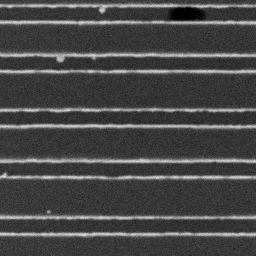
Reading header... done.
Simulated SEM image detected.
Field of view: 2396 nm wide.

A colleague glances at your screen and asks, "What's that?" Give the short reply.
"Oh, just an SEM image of lines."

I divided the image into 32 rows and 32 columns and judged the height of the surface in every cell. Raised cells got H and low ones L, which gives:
HHHHHHHHHHHHHHHHHHHHHHHHHHHHHHHH
LLLLLLLLLLLLLLLLLLLLLLLLLLLLLLLL
LLLLLLLLLLLLLLLLLLLLLLLLLLLLLLLL
HHHHHHHHHHHHHHHHHHHHHHHHHHHHHHHH
HHHHHHHHHHHHHHHHHHHHHHHHHHHHHHHH
HHHHHHHHHHHHHHHHHHHHHHHHHHHHHHHH
HHHHHHHHHHHHHHHHHHHHHHHHHHHHHHHH
LLLLLLLLLLLLLLLLLLLLLLLLLLLLLLLL
LLLLLLLLLLLLLLLLLLLLLLLLLLLLLLLL
HHHHHHHHHHHHHHHHHHHHHHHHHHHHHHHH
HHHHHHHHHHHHHHHHHHHHHHHHHHHHHHHH
HHHHHHHHHHHHHHHHHHHHHHHHHHHHHHHH
HHHHHHHHHHHHHHHHHHHHHHHHHHHHHHHH
HHHHHHHHHHHHHHHHHHHHHHHHHHHHHHHH
LLLLLLLLLLLLLLLLLLLLLLLLLLLLLLLL
LLLLLLLLLLLLLLLLLLLLLLLLLLLLLLLL
HHHHHHHHHHHHHHHHHHHHHHHHHHHHHHHH
HHHHHHHHHHHHHHHHHHHHHHHHHHHHHHHH
HHHHHHHHHHHHHHHHHHHHHHHHHHHHHHHH
HHHHHHHHHHHHHHHHHHHHHHHHHHHHHHHH
LLLLLLLLLLLLLLLLLLLLLLLLLLLLLLLL
LLLLLLLLLLLLLLLLLLLLLLLLLLLLLLLL
HHHHHHHHHHHHHHHHHHHHHHHHHHHHHHHH
HHHHHHHHHHHHHHHHHHHHHHHHHHHHHHHH
HHHHHHHHHHHHHHHHHHHHHHHHHHHHHHHH
HHHHHHHHHHHHHHHHHHHHHHHHHHHHHHHH
HHHHHHHHHHHHHHHHHHHHHHHHHHHHHHHH
LLLLLLLLLLLLLLLLLLLLLLLLLLLLLLLL
LLLLLLLLLLLLLLLLLLLLLLLLLLLLLLLL
HHHHHHHHHHHHHHHHHHHHHHHHHHHHHHHH
HHHHHHHHHHHHHHHHHHHHHHHHHHHHHHHH
HHHHHHHHHHHHHHHHHHHHHHHHHHHHHHHH